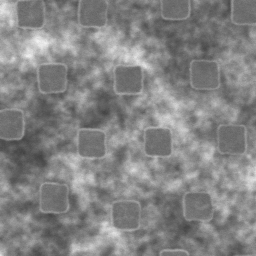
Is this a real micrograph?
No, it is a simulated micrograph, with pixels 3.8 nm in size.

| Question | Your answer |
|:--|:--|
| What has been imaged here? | a regular array of raised bodies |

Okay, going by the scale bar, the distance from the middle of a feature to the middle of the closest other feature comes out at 0.265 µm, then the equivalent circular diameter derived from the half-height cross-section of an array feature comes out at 122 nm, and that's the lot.